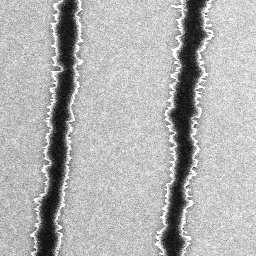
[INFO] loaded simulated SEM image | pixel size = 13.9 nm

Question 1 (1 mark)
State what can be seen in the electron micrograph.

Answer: one or a few lines or trenches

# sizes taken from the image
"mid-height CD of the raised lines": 328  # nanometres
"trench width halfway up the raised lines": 1400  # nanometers